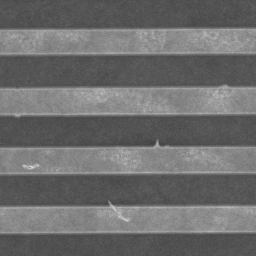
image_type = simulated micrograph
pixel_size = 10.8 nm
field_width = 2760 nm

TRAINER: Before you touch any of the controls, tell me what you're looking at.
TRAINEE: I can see parallel lines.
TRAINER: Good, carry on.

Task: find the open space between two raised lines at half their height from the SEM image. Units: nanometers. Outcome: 337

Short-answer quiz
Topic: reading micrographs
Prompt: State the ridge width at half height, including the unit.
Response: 296 nanometres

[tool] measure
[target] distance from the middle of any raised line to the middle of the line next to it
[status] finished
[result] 0.639 µm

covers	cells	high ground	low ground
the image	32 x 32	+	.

................................
................................
................................
................................
++++++++++++++++++++++++++++++++
++++++++++++++++++++++++++++++++
++++++++++++++++++++++++++++++++
................................
................................
................................
................................
++++++++++++++++++++++++++++++++
++++++++++++++++++++++++++++++++
++++++++++++++++++++++++++++++++
.++.............................
................................
................................
................................
++++++++++++++++++++++++++++++++
++++++++++++++++++++++++++++++++
++++++++++++++++++++++++++++++++
++++++++++++++++++++++++++++++++
................................
................................
................................
................................
++++++++++++++++++++++++++++++++
++++++++++++++++++++++++++++++++
++++++++++++++++++++++++++++++++
................................
................................
................................